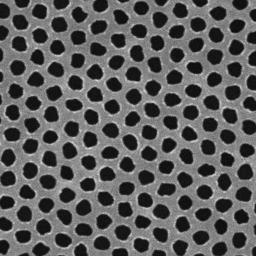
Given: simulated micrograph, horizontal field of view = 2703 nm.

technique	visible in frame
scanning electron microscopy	a regular array of holes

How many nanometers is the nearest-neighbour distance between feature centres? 227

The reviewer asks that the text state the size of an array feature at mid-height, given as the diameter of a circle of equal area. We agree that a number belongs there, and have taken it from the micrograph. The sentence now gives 162 nanometres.